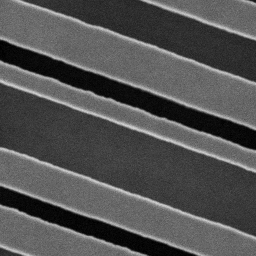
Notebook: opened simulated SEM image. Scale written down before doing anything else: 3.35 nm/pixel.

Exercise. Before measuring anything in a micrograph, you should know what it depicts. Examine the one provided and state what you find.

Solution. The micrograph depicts lines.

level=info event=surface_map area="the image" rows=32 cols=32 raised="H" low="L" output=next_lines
HHHHLLLLLLLLLLLLLLLHHHHHHHHHHHHH
HHHHHHHLLLLLLLLLLLLLLLHHHHHHHHHH
HHHHHHHHHHLLLLLLLLLLLLLLLHHHHHHH
HHHHHHHHHHHHHLLLLLLLLLLLLLLLHHHH
HHHHHHHHHHHHHHHLLLLLLLLLLLLLLLHH
LLHHHHHHHHHHHHHHHHLLLLLLLLLLLLLL
LLLLHHHHHHHHHHHHHHHHHLLLLLLLLLLL
LLLLLLLHHHHHHHHHHHHHHHHHLLLLLLLL
HHLLLLLLLLHHHHHHHHHHHHHHHHLLLLLL
HHHHHLLLLLLLLHHHHHHHHHHHHHHHHHLL
LHHHHHHHLLLLLLLLHHHHHHHHHHHHHHHH
LLLLHHHHHHHLLLLLLLLHHHHHHHHHHHHH
LLLLLLHHHHHHHHLLLLLLLHHHHHHHHHHH
LLLLLLLLLHHHHHHHHLLLLLLLHHHHHHHH
LLLLLLLLLLLLHHHHHHHLLLLLLLLHHHHH
LLLLLLLLLLLLLLLHHHHHHHHLLLLLLLHH
LLLLLLLLLLLLLLLLLLHHHHHHHLLLLLLL
LLLLLLLLLLLLLLLLLLLLLHHHHHHHLLLL
LLLLLLLLLLLLLLLLLLLLLLLHHHHHHHHL
HHHLLLLLLLLLLLLLLLLLLLLLLLHHHHHH
HHHHHHLLLLLLLLLLLLLLLLLLLLLLLHHH
HHHHHHHHHLLLLLLLLLLLLLLLLLLLLLLL
HHHHHHHHHHHHLLLLLLLLLLLLLLLLLLLL
LHHHHHHHHHHHHHLLLLLLLLLLLLLLLLLL
LLLLHHHHHHHHHHHHHLLLLLLLLLLLLLLL
LLLLLLLHHHHHHHHHHHHHLLLLLLLLLLLL
HHHLLLLLLHHHHHHHHHHHHHHLLLLLLLLL
HHHHHLLLLLLLHHHHHHHHHHHHHHLLLLLL
HHHHHHHHLLLLLLLHHHHHHHHHHHHHHLLL
HHHHHHHHHHHLLLLLLLHHHHHHHHHHHHHH
HHHHHHHHHHHHHHLLLLLLLHHHHHHHHHHH
LLHHHHHHHHHHHHHHHLLLLLLHHHHHHHHH